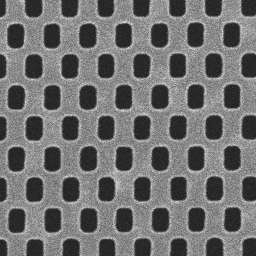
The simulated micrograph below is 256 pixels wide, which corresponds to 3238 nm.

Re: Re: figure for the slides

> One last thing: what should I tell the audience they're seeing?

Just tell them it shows a regular array of holes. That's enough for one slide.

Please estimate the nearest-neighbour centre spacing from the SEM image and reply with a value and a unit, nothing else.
0.446 micrometres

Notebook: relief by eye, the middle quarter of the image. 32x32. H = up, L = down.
LLLLHHHHLLLLLHHHHLLLLLHHHHLLLLLH
LLLLHHHHLLLLLHHHHLLLLLHHHHLLLLLH
LLLLHHHHLLLLLHHHHLLLLHHHHHLLLLHH
LLLHHHHHHLLLHHHHHHLLHHHHHHHLLHHH
HHHHHHHHHHHHHHHHHHHHHHHHHHHHHHHH
HHHHHLLHHHHHHLLLLHHHHHHLLLHHHHHL
HHHHLLLLHHHHHLLLLHHHHHLLLLHHHHHL
HHHHLLLLHHHHHLLLLHHHHHLLLLHHHHHL
HHHHLLLLHHHHHLLLLHHHHHLLLLHHHHHL
HHHHLLLLHHHHHLLLLHHHHHLLLLHHHHHL
HHHHLLLLHHHHHLLLLHHHHHLLLLHHHHHL
HHHHHLLHHHHHHHHHHHHHHHHHHHHHHHHH
HHHHHHHHHHHHHHHHHHHHHHHHHHHHHHHH
LLLHHHHHHLLLHHHHHHLLLHHHHHHLLLLH
LLLLHHHHLLLLLHHHHLLLLLHHHHLLLLLH
LLLLHHHHLLLLLHHHHLLLLLHHHHLLLLLH
LLLLHHHHLLLLLHHHHLLLLLHHHHLLLLLH
LLLLHHHHLLLLLHHHHLLLLLHHHHLLLLLH
LLLLHHHHHLLLHHHHHHLLLHHHHHHLLLHH
HHHHHHHHHHHHHHHHHHHHHHHHHHHHHHHH
HHHHHHLHHHHHHHHHHHHHHHHLLHHHHHHH
HHHHLLLLHHHHHLLLLHHHHHLLLLHHHHHL
HHHHLLLLHHHHHLLLLHHHHHLLLLHHHHHL
HHHHLLLLHHHHHLLLLHHHHHLLLLHHHHHL
HHHHLLLLHHHHHLLLLHHHHHLLLLHHHHHL
HHHHLLLLHHHHHLLLLHHHHHLLLLHHHHHL
HHHHLLLLHHHHHLLLHHHHHHHLLHHHHHHH
HHHHHHHHHHHHHHHHHHHHHHHHHHHHHHHH
HLLHHHHHHLLLHHHHHHLLLHHHHHHLLLHH
LLLLHHHHLLLLLHHHHHLLLLHHHHLLLLLH
LLLLHHHHLLLLLHHHHLLLLLHHHHLLLLLH
LLLLHHHHLLLLLHHHHLLLLLHHHHLLLLLH